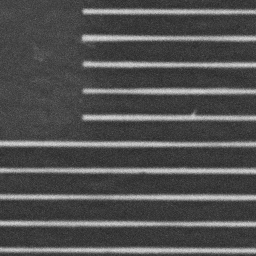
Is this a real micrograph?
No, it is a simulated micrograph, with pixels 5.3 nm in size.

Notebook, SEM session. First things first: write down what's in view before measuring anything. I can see parallel lines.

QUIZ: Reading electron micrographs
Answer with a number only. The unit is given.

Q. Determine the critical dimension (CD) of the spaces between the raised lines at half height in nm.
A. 120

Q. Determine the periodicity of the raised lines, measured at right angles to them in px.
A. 26.5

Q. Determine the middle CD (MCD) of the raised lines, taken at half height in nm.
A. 18.6